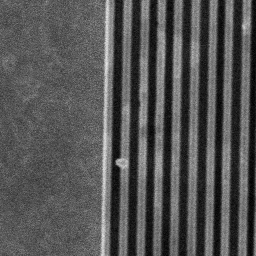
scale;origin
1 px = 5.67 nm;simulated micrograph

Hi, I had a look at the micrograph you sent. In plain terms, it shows parallel lines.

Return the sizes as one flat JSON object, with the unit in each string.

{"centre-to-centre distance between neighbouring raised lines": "0.0968 micrometres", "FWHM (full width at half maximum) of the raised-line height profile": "43.2 nm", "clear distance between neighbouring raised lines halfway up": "0.0524 micrometres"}